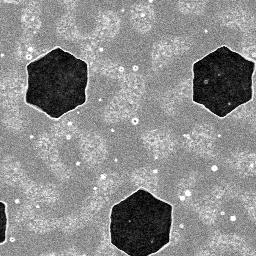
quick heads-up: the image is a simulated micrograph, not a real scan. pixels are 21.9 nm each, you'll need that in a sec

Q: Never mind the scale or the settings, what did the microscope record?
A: holes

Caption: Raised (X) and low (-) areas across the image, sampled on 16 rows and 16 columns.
XXXXXXXXXXXXXXXX
XXXXXXXXXXXXXXXX
XXXXXXXXXXXXXXXX
XXX--XXXXXXXX--X
XX---XXXXXXX----
XX---XXXXXXX----
XX---XXXXXXXX--X
XXXXXXXXXXXXXXXX
XXXXXXXXXXXXXXXX
XXXXXXXXXXXXXXXX
XXXXXXXXXXXXXXXX
XXXXXXXXXXXXXXXX
XXXXXXXX--XXXXXX
XXXXXXX----XXXXX
XXXXXXX----XXXXX
XXXXXXX---XXXXXX